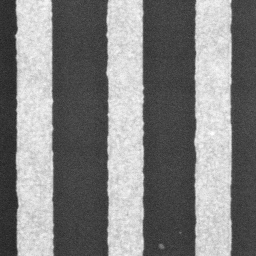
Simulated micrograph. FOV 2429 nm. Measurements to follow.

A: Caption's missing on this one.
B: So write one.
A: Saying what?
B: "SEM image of lines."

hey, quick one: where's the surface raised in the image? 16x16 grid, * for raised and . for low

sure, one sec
.**....**...**..
.**....**...**..
.**....**...**..
.**....**...**..
.**....**...**..
.**....**...**..
.**....**...**..
.**....**...**..
.**....**...**..
.**....**...**..
.**....**...**..
.**....**...**..
.**....**...**..
.**....**...**..
.**....**...**..
.**....**...**..